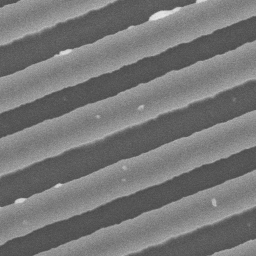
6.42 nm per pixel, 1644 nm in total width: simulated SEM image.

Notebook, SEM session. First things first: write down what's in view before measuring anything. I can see lines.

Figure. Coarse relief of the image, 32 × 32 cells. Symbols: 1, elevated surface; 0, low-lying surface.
01111111111110000000000011111111
11111111111000000000111111111111
11111111000000000011111111111100
11111100000000001111111111110000
11100000000000111111111110000000
10000000000111111111110000000001
00000000111111111111000000000111
00000011111111111000000000111111
00011111111111100000000111111111
01111111111100000000111111111111
11111111110000000011111111111100
11111110000000011111111111100000
11110000000001111111111110000000
11000000001111111111110000000000
00000000111111111111000000000011
00000111111111111000000000011111
00111111111111000000000001111111
11111111111100000000001111111111
11111111100000000000111111111110
11111110000000000111111111111000
11110000000000111111111111000000
10000000000011111111111000000001
00000000011111111111100000000111
00000011111111111100000000111111
00001111111111100000000011111111
00111111111110000000011111111111
11111111111000000001111111111100
11111111000000001111111111100000
11111000000001111111111110000000
11100000000111111111110000000000
00000000111111111111000000000011
00000111111111111000000000011111